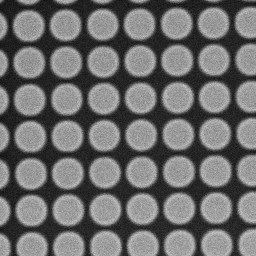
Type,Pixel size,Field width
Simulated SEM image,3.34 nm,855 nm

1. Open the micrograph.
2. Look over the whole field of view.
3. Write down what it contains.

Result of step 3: an array of small figures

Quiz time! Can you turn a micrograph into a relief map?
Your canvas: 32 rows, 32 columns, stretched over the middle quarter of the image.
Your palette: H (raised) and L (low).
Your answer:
HHHHLLHHHHHHHLLLHHHHHHHLLHHHHHHH
HHHHLLLHHHHHHLLLHHHHHHLLLHHHHHHL
HHHLLLLLHHHHLLLLLHHHHLLLLLHHHHLL
LLLLLLLLLLLLLLLLLLLLLLLLLLLLLLLL
LLLLLLLLLLLLLLLLLLLLLLLLLLLLLLLL
HHLLLLLLHHHHLLLLLHHHHLLLLLHHHHHL
HHHHLLLHHHHHHLLLHHHHHHLLLHHHHHHH
HHHHLLHHHHHHHHLLHHHHHHHLLHHHHHHH
HHHHLLHHHHHHHHLHHHHHHHHLLHHHHHHH
HHHHLLHHHHHHHHLHHHHHHHHLLHHHHHHH
HHHHLLLHHHHHHLLLHHHHHHLLLHHHHHHH
HHHLLLLHHHHHLLLLLHHHHHLLLLHHHHHL
HHLLLLLLLLLLLLLLLLLLLLLLLLLLLLLL
LLLLLLLLLLLLLLLLLLLLLLLLLLLLLLLL
HHLLLLLLLHHLLLLLLLHHHLLLLLHHHHLL
HHHHLLLHHHHHHLLLHHHHHHLLLLHHHHHH
HHHHLLLHHHHHHHLLHHHHHHHLLHHHHHHH
HHHHHLHHHHHHHHLLHHHHHHHLLHHHHHHH
HHHHHLHHHHHHHHLLHHHHHHHLLHHHHHHH
HHHHLLLHHHHHHHLLHHHHHHHLLHHHHHHH
HHHHLLLHHHHHHLLLLHHHHHLLLLHHHHHL
HHLLLLLLLHHLLLLLLLLLLLLLLLLLLLLL
LLLLLLLLLLLLLLLLLLLLLLLLLLLLLLLL
LLLLLLLLLLLLLLLLLLHHHLLLLLLHHHHL
HHHLLLLHHHHHHLLLLHHHHHLLLLHHHHHH
HHHHLLLHHHHHHHLLHHHHHHHLLHHHHHHH
HHHHHLLHHHHHHHLLHHHHHHHLLHHHHHHH
HHHHHLLHHHHHHHLLHHHHHHHLLHHHHHHH
HHHHHLLHHHHHHHLLHHHHHHHLLHHHHHHH
HHHHLLLHHHHHHLLLLHHHHHLLLLHHHHHL
HHHLLLLLLHHHLLLLLLHHHLLLLLLLHHLL
LLLLLLLLLLLLLLLLLLLLLLLLLLLLLLLL